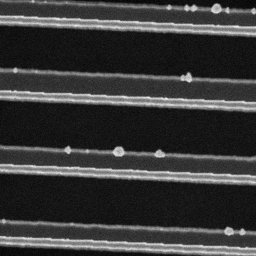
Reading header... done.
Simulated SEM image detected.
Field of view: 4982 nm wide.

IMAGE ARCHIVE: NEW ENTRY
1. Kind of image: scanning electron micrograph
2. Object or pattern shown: lines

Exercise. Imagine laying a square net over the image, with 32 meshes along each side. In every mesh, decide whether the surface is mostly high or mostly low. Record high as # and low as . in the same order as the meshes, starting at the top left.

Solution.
##########......................
################################
################################
...............#.###############
................................
................................
................................
................................
................................
##############.........#........
################################
################################
........########################
.............................###
................................
................................
................................
................................
................................
#####################...........
################################
....############################
.........................#######
................................
................................
................................
................................
................................
################................
################################
..##############################
........................########